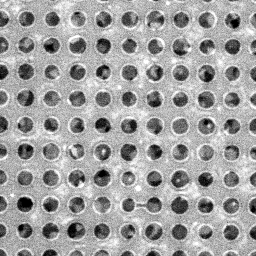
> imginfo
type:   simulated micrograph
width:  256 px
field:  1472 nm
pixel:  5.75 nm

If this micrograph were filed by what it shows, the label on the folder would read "a regular array of raised bodies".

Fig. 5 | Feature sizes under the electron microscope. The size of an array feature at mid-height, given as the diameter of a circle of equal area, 18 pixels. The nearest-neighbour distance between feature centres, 147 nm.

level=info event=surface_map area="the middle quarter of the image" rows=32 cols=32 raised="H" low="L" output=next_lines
LLHHHLLLLHHLLLLHHHLLLHHHLLLLHHHL
LHHHHHLLHHHHLLHHHHLLLHHHHLLHHHHL
LHHHHHLLHHHHLLHHHHLLHHHHHLLHHHHL
LLHHHLLLHHHHLLHHHHLLLHHHHLLHHHHL
LLLLLLLLLLLLLLLLLLLLLLLLLLLLLHLL
LLLLLLLLLLLLLLLLLLLLLLLLLLLLLLLL
LLLLLLLLLLLLLLLLLLLLLLLLLLLLLLLL
LHHHHLLLHHHLLLLHHHLLLHHHHLLLHHHL
LHHHHLLLHHHHLLHHHHLLLHHHHLLHHHHL
LHHHHLLLHHHHLLHHHHLLLHHHHLLHHHHL
LLHHHLLLLHHLLLLHHHLLLHHHLLLLHHHL
LLLLLLLLLLLLLLLLLLLLLLLLLLLLLLLL
LLLLLLLLLLLLLLLLLLLLLLLLLLLLLLLL
LLHHLLLLLHHLLLLHHLLLLLHHLLLLLHLL
LHHHHLLLHHHHLLHHHHLLLHHHHLLHHHHL
LHHHHLLLHHHHLLHHHHLLHHHHHLLHHHHL
LHHHHLLLHHHLLLHHHHLLLHHHHLLHHHHL
LLHHLLLLLLLLLLLHHLLLLLHHLLLLHHLL
LLLLLLLLLLLLLLLLLLLLLLLLLLLLLLLL
LLLLLLLLLLLLLLLLLLLLLLLLLLLLLLLL
LLHHHLLLHHHLLLLHHHLLLHHHLLLLHHHL
LHHHHLLHHHHHLLHHHHLLLHHHHLLHHHHL
LHHHHLLHHHHHLLHHHHLLLHHHHLLHHHHL
LLHHHLLLHHHLLLHHHHLLLHHHLLLHHHHL
LLLLLLLLLLLLLLLLLLLLLLLLLLLLLLLL
LLLLLLLLLLLLLLLLLLLLLLLLLLLLLLLL
LLHHLLLLLHHLLLLLLLLLLLLLLLLLHHLL
LHHHHLLLHHHHLLHHHHLLLHHHLLLHHHHL
LHHHHLLHHHHHLLHHHHLLLHHHHLLHHHHL
LHHHHLLHHHHHLLHHHHLLLHHHLLLHHHHL
LLHHLLLLHHHLLLLHHLLLLHHHLLLHHHHL
LLLLLLLLLLLLLLLLLLLLLLLLLLLLLLLL